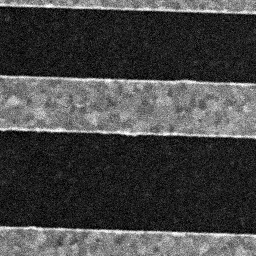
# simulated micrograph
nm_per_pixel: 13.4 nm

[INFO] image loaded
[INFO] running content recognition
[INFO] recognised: one or a few lines or trenches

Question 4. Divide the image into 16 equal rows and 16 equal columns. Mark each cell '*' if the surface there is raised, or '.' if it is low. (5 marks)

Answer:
.......*********
................
................
................
................
****************
****************
****************
..............**
................
................
................
................
................
********........
****************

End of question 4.